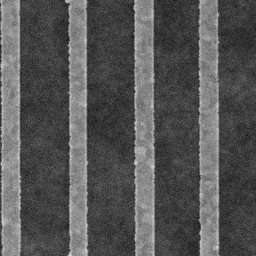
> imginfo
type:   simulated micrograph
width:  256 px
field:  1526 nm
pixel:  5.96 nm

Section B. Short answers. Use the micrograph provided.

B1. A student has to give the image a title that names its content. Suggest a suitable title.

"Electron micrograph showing lines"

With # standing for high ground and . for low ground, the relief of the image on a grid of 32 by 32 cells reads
##.......##......##......##.....
##.......##......##......##.....
##.......##......##......##.....
##.......##......##......##.....
##.......##......##......##.....
##.......##......##......##.....
##.......##......##......##.....
##.......##......##......##.....
##.......##......##......##.....
##.......##......##......##.....
##.......##......##......##.....
##.......##......##......##.....
##.......##......##......##.....
##.......##......##......##.....
##.......##......##......##.....
##.......##......##......##.....
##.......##......##......##.....
###......##......##......##.....
##.......##......##......##.....
##.......##......##......##.....
##.......##......##......##.....
##.......##......##......##.....
###......##......##......##.....
###......##......##......##.....
###......##......##......##.....
###......##......##......##.....
###......##......##......##.....
###......##......##......##.....
###......##......##......##.....
###......##......##......##.....
###......##......##......##.....
##.......##......##......##.....